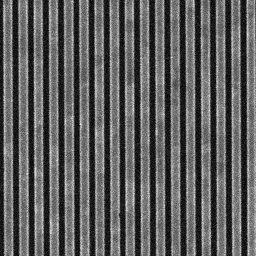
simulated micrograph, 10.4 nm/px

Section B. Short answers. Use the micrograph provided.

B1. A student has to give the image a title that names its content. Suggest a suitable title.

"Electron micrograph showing parallel lines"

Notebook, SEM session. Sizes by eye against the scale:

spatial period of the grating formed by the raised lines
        158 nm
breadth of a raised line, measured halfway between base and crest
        83.3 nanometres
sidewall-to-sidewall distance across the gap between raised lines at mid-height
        0.0742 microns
